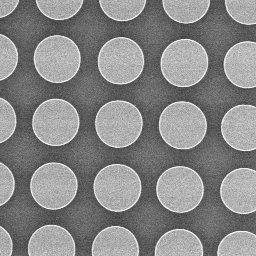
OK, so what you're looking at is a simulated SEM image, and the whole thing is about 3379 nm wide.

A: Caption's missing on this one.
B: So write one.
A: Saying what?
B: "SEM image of an array of small figures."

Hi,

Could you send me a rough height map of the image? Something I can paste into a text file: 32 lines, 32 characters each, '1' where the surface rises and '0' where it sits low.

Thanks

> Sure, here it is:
11000111110001111100111111001111
10000111110001111100011111000111
00000000000000010000001110000111
00000000000000000000000000000000
10000001000000000000000000000000
11000111100001111000011110000011
11001111110011111100111111001111
11001111110011111100111111001111
11000111110011111100111111001111
10000111100001111000011110001111
00000000000000010000001100000111
00000000000000000000000000000000
10000011000000000000000000000000
11000111100001111000011110000111
11001111110011111100111111001111
11001111110011111100111111001111
11001111110011111100111111001111
10000111100001111000011110001111
00000000000000000000001100000111
00000000000000000000000000000000
00000011000000000000000000000000
10001111100011111000011100000111
11001111110011111000111110001111
11001111110011111100111110001111
10001111100011111000111110001111
00000111100001111000111110001111
00000000000000000000001000000111
00000000000000000000000000000000
00000111000001100000000000000000
10001111100011111000111100001111
10001111100011111000111110011111
10001111100011111001111110011111